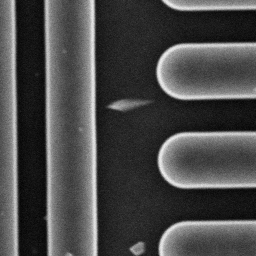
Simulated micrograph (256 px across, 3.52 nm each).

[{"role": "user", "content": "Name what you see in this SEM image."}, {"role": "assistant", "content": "groups of lines, slits or small figures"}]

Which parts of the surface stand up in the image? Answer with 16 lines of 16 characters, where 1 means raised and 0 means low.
1001110000011111
1001110000000000
1001110000000000
1001110000111111
1001110000111111
1001110000111111
1001110000000000
1001110000000000
1001110000011111
1001110000111111
1001110000111111
1001110000011111
1001110000000000
1001110000000000
1001110000111111
1001110000111111